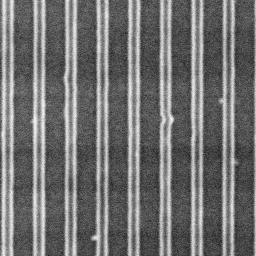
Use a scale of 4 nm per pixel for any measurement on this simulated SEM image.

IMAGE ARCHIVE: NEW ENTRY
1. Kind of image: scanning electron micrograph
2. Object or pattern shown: parallel lines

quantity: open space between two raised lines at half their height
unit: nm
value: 85.1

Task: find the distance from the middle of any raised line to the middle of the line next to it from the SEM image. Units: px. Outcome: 31.6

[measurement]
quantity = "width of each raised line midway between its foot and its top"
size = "0.0385 micrometres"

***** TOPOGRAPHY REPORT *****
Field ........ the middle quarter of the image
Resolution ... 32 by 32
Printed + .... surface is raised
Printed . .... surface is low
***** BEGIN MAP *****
.++.....+++.....+++.....++......
.++.....+++.....+++.....++......
+++.....+++.....+++.....++......
+++.....+++.....+++.....++......
+++......++.....+++.....++......
.++......++.....+++.....++......
.++......++.....+++.....++......
.++......++.....+++.....++......
.++......++.....+++.....++......
.++......++.....+++.....++......
.++......++.....+++.....++......
.++......++.....+++.....++......
.++......++.....++......++......
.++......++.....++.......++.....
.++......++.....+++......++.....
.++......++.....+++.....++......
.++......++......++.....++......
.++......++......++.....++......
.++......++.....+++.....++......
.++.....+++.....+++.....++......
.++.....+++.....+++.....++......
.++.....+++.....++......++......
.++.....+++.....++......++......
.++......++.....++......++......
.++......++.....++......++......
.++......++.....++......++......
.++......++.....+++.....++......
.++.....+++.....++......++......
.++.....+++.....++......++......
.++.....+++.....+++.....++......
.++.....+++.....+++.....++......
.++.....+++.....++......++......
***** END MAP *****